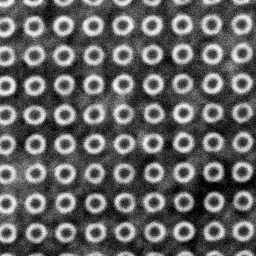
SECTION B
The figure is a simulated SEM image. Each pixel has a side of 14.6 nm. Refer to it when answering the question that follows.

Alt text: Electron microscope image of a regular array of raised bodies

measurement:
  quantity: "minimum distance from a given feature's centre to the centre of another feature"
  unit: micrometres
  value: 0.428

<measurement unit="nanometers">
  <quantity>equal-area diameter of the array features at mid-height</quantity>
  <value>248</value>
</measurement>